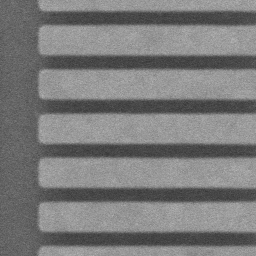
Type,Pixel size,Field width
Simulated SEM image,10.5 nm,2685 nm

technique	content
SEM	groups of lines, slits or small figures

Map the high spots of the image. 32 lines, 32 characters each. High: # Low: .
.....###########################
................................
................................
.....###########################
.....###########################
.....###########################
.....###########################
................................
................................
.....###########################
.....###########################
.....###########################
................................
................................
.....###########################
.....###########################
.....###########################
.....###########################
................................
................................
.....###########################
.....###########################
.....###########################
................................
................................
.....###########################
.....###########################
.....###########################
.....###########################
................................
................................
.....###########################